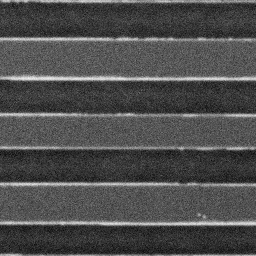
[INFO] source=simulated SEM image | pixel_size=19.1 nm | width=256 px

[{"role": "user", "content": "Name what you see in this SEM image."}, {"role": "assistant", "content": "lines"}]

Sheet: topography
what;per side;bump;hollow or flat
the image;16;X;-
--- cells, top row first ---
----------------
----------------
XXXXXXXXXXXXXXXX
XXXXXXXXXXXXXXXX
XXXXXXXXXXXXXXXX
----------------
----------------
XXXXXXXXXXXXXXXX
XXXXXXXXXXXXXXXX
----------------
----------------
XXXXXXXXXX------
XXXXXXXXXXXXXXXX
XXXXXXXXXXXXXXXX
----------------
----------------